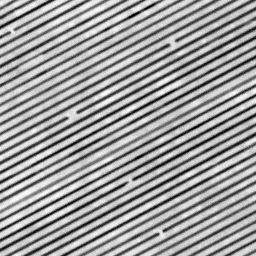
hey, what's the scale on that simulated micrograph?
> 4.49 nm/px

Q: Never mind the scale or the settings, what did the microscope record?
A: parallel lines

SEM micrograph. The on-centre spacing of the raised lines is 38.4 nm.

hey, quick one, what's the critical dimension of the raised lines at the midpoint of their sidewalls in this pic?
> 0.0233 microns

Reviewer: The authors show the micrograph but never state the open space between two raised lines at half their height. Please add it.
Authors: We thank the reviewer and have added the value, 15.4 nanometers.